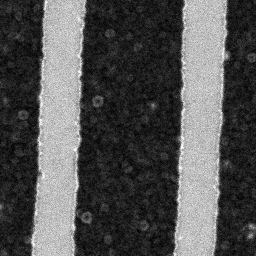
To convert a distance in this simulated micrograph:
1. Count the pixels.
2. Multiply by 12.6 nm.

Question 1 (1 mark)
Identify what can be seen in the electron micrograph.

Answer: one or a few lines or trenches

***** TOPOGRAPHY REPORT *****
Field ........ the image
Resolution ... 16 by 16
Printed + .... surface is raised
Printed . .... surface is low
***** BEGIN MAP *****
+++..+++++++..++
+++..+++++++..++
+++..++++++...++
+++..++++++...++
+++..++++++...++
+++..++++++...++
+++..++++++...++
+++..++++++...++
+++..++++++...++
++...++++++...++
++...++++++...++
++...++++++...++
++...++++++...++
++...++++++..+++
++...++++++..+++
++...++++++..+++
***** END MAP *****